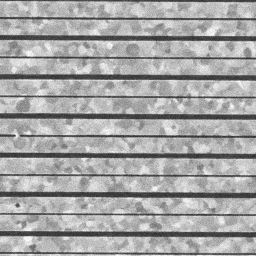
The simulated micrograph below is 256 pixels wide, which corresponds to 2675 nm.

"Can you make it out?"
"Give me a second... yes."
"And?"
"parallel lines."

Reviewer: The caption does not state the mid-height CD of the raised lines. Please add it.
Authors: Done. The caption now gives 0.161 micrometres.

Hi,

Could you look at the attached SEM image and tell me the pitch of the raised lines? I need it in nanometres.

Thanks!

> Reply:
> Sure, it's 205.